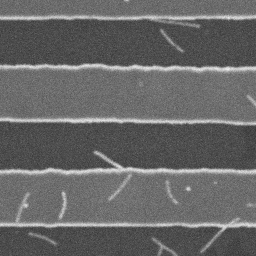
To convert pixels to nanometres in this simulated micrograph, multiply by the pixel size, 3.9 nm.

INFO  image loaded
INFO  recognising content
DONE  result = lines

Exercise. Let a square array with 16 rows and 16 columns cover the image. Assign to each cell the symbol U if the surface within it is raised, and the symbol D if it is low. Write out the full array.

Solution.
UUUUUUUUUUUUUUUU
DDDDDDDDDDDDDDDD
DDDDDDDDDDDDDDDD
DDDDDDDDDDDDDDDD
UUUUUUUUUUUUUUUU
UUUUUUUUUUUUUUUU
UUUUUUUUUUUUUUUU
UUUUUUUUUUUUUUUU
DDDDDDDDDDDDDDDD
DDDDDDDDDDDDDDDD
DDDDDDDUDDDDDDDD
UUUUUUUUUUUUUUUU
UUUUUUUUUUUUUUUU
UUUUUUUUUUUUUUUU
DDDDDDDDDDDDDDDD
DDDDDDDDDDDDDDDD